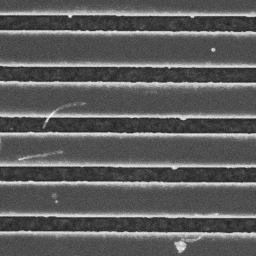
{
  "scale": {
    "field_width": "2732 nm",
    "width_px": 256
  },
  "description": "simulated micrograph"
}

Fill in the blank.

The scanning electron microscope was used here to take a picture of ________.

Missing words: lines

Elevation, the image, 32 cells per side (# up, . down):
################################
################################
................................
................................
################################
################################
################################
################################
................................
................................
################################
################################
################################
################################
################################
................................
................................
################################
################################
################################
################################
................................
................................
################################
################################
################################
################################
................................
................................
################################
################################
################################